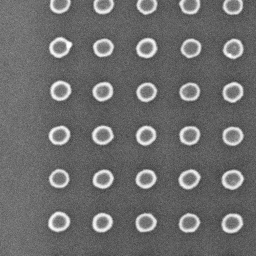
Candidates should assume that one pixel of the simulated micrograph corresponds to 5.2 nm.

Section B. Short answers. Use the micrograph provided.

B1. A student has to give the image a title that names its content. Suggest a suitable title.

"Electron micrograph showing a regular array of raised bodies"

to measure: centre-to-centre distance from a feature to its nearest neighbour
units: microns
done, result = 0.223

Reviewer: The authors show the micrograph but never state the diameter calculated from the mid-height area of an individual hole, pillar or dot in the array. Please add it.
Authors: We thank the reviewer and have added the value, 95.8 nm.